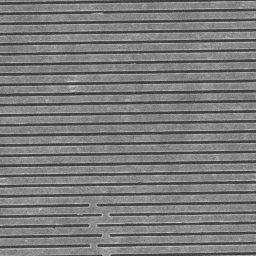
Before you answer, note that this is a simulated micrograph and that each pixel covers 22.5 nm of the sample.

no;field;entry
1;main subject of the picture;parallel lines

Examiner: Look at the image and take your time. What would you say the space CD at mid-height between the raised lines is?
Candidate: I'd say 70.2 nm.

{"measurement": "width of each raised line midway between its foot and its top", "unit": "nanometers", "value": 152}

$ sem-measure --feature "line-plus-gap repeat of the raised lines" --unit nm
228